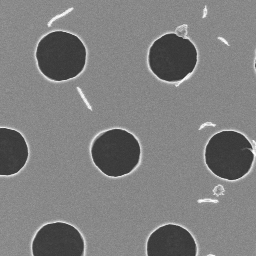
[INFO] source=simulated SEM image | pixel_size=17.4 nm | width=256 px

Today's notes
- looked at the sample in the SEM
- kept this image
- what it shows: holes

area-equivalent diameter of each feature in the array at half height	0.841	um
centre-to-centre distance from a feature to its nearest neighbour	1.93	micrometres